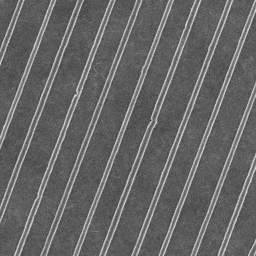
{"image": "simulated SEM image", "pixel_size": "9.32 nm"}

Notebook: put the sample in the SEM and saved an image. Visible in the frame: parallel lines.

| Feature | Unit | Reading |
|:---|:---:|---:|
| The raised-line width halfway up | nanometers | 43.6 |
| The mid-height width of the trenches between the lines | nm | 192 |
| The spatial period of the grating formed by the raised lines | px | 27.5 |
